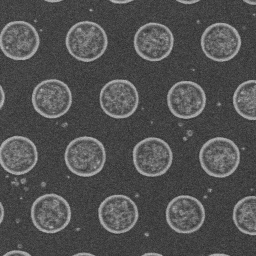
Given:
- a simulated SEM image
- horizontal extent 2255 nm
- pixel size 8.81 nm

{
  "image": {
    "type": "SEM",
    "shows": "a regular array of raised bodies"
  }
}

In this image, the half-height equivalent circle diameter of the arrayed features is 0.327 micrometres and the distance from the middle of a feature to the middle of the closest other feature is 0.584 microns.